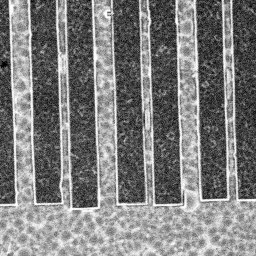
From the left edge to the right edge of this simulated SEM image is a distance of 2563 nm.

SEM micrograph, parallel lines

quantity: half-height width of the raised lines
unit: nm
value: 278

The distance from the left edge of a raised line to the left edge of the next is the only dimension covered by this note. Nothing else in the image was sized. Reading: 0.416 microns